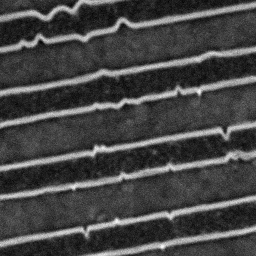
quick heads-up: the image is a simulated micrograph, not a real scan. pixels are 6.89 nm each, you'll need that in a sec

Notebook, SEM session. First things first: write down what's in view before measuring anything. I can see one or a few lines or trenches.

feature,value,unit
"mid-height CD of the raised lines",210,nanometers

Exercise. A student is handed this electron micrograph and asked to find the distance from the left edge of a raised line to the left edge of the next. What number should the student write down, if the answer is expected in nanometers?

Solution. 507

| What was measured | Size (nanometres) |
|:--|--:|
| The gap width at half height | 297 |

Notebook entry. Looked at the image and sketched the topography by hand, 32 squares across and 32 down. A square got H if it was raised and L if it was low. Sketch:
LLLLLLLLLLHHHHHHHHHHHHHHHHHHHHHH
LLLLLLLHHHHHHHHHHHHHHHHHHHHLLLLL
HHHHHHHHHHHHHHHHHHHHHLLLLLLLLLLL
HHHHHHHHHHHHHHLLLLLLLLLLLLLLLLLL
HHHHHHHHHHHLLLLLLLLLLLLLLLLLLLLL
HHHHLLLLLLLLLLLLLLLLLLLLLLLLLLLL
LLLLLLLLLLLLLLLLLLLLLLLLLLLLLLHH
LLLLLLLLLLLLLLLLLLLLLLLLHHHHHHHH
LLLLLLLLLLLLLLLLLLHHHHHHHHHHHHHH
LLLLLLLLLLLLHHHHHHHHHHHHHHHHHHHH
LLLLLLLHHHHHHHHHHHHHHHHHHHHHLLLL
LHHHHHHHHHHHHHHHHHHHHHLLLLLLLLLL
HHHHHHHHHHHHHHHHHHLLLLLLLLLLLLLL
HHHHHHHHHHHLLLLLLLLLLLLLLLLLLLLL
HHHHHHLLLLLLLLLLLLLLLLLLLLLLLLLL
HLLLLLLLLLLLLLLLLLLLLLLLLLLLLLLL
LLLLLLLLLLLLLLLLLLLLLLLLLLLHLHHH
LLLLLLLLLLLLLLLLLLLLHHHHHHHHHHHH
LLLLLLLLLLLLLLLHHHHHHHHHHHHHHHHH
LLLLLLLLLHHHHHHHHHHHHHHHHHHHHLLL
LLLHHHHHHHHHHHHHHHHHHHHHHLLLLLLL
HHHHHHHHHHHHHHHHHHLLLLLLLLLLLLLL
HHHHHHHHHHHHHHLLLLLLLLLLLLLLLLLL
HHHHHHHHLLLLLLLLLLLLLLLLLLLLLLLL
HLLLLLLLLLLLLLLLLLLLLLLLLLLLLLLL
LLLLLLLLLLLLLLLLLLLLLLLLLLLLHHHH
LLLLLLLLLLLLLLLLLLLLLLLHHHHHHHHH
LLLLLLLLLLLLLLLLLHHHHHHHHHHHHHHH
LLLLLLLLLLLLHHHHHHHHHHHHHHHHHHHH
LLLLLLHHHHHHHHHHHHHHHHHHHHHLLLLL
HHHHHHHHHHHHHHHHHHHHHLLLLLLLLLLL
HHHHHHHHHHHHHHHLLLLLLLLLLLLLLLLL